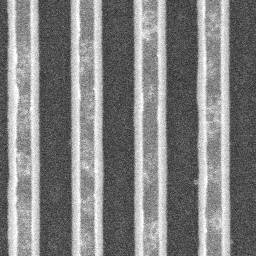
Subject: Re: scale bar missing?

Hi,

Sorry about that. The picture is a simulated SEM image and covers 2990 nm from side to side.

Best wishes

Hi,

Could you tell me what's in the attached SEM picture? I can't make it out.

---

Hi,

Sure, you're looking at one or a few lines or trenches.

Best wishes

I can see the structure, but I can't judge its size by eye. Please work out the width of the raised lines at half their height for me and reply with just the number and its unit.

272 nm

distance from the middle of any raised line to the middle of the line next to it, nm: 740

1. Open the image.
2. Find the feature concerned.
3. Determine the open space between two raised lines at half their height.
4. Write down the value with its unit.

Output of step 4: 468 nm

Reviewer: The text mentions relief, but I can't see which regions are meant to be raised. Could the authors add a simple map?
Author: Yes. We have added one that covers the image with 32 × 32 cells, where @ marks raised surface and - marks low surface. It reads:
--@@-----@@@-----@@@-----@@@----
-@@@-----@@@-----@@@-----@@@----
-@@@-----@@@-----@@@-----@@@----
-@@@-----@@@-----@@@-----@@@----
-@@@-----@@@-----@@@-----@@@----
-@@@-----@@@-----@@@-----@@@----
-@@@-----@@@-----@@@-----@@@----
-@@@-----@@@-----@@@-----@@@----
-@@@-----@@@-----@@@-----@@@----
-@@@-----@@@-----@@@-----@@@----
-@@@-----@@@-----@@@-----@@@----
-@@@-----@@@-----@@@-----@@@----
--@@------@@-----@@@-----@@@----
--@@------@@-----@@@-----@@@----
--@@------@@-----@@@-----@@@----
--@@------@@-----@@@-----@@@----
--@@------@@-----@@@-----@@@----
--@@------@@-----@@@-----@@@----
--@@-----@@@-----@@@-----@@@----
--@@-----@@@-----@@@-----@@@----
--@@-----@@@-----@@@-----@@@----
--@@------@@-----@@@-----@@@----
--@@-----@@@-----@@@-----@@@----
--@@-----@@@-----@@@-----@@@----
--@@-----@@@-----@@@-----@@@----
-@@@------@@-----@@@-----@@@----
--@@------@@-----@@@-----@@@----
--@@------@@-----@@@-----@@@----
--@@------@@-----@@@-----@@@----
--@@------@@-----@@@-----@@@----
--@@------@@-----@@@-----@@@----
--@@------@@-----@@@-----@@@----